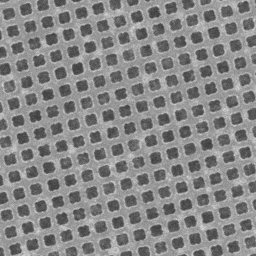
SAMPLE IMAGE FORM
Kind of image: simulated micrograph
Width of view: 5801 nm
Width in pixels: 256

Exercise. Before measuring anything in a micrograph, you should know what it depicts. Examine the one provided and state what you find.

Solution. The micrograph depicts a regular array of holes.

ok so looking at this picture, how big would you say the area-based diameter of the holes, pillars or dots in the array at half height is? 13.2 pixels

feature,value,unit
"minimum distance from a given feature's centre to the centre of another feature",17.5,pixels